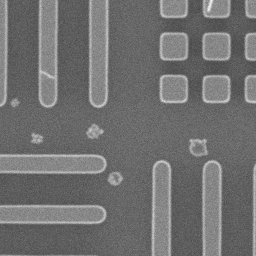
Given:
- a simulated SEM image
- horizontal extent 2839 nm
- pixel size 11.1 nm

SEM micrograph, groups of lines, slits or small figures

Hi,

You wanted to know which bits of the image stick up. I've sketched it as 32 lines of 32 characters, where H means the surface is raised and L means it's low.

HLLLLHHLLLLHHLLLLLLLHHHLLLHHHLLH
HLLLLHHLLLLHHLLLLLLLHHHLLLHHHLLH
HLLLLHHLLLLHHLLLLLLLLLLLLLLLLLLL
HLLLLHHLLLLHHLLLLLLLLLLLLLLLLLLL
HLLLLHHLLLLHHLLLLLLLHHHLLLHHHLLH
HLLLLHHLLLLHHLLLLLLLHHHLLHHHHLLH
HLLLLHHLLLLHHLLLLLLLHHHLLHHHHLLH
HLLLLHHLLLLHHLLLLLLLLLLLLLLLLLLL
HLLLLHHLLLLHHLLLLLLLLLLLLLLLLLLL
HLLLLHHLLLLHHLLLLLLLHHHLLLHHLLLH
HLLLLHHLLLLHHLLLLLLLHHHLLHHHHLLH
HLLLLHHLLLLHHLLLLLLLHHHLLHHHHLLH
HLLLLHHLLLLHHLLLLLLLHHHLLLHHLLLH
LLLLLLLLLLLLLLLLLLLLLLLLLLLLLLLL
LLLLLLLLLLLLLLLLLLLLLLLLLLLLLLLL
LLLLLLLLLLLLLLLLLLLLLLLLLLLLLLLL
LLLLLLLLLLLLLLLLLLLLLLLLLLLLLLLL
LLLLLLLLLLLLLLLLLLLLLLLLLLLLLLLL
LLLLLLLLLLLLLLLLLLLLLLLLLLLLLLLL
HHHHHHHHHHHHLLLLLLLLLLLLLLLLLLLL
HHHHHHHHHHHHHLLLLLLLHLLLLLHLLLLL
LLHHHHHHHHHHLLLLLLLHHLLLLHHHLLLL
LLLLLLLLLLLLLLLLLLLHHLLLLHHHLLLL
LLLLLLLLLLLLLLLLLLLHHLLLLHHHLLLL
LLLLLLLLLLLLLLLLLLLHHLLLLHHHLLLL
LLLLLLLLLLLLLLLLLLLHHLLLLHHHLLLL
HHHHHHHHHHHHHLLLLLLHHLLLLHHHLLLL
HHHHHHHHHHHHHLLLLLLHHLLLLHHHLLLL
LLLLLLLLLLLLLLLLLLLHHLLLLHHHLLLL
LLLLLLLLLLLLLLLLLLLHHLLLLHHHLLLL
LLLLLLLLLLLLLLLLLLLHHLLLLLHLLLLL
LLLLLLLLLLLLLLLLLLLHHLLLLLHLLLLL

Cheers